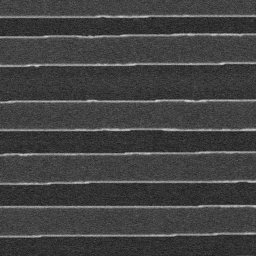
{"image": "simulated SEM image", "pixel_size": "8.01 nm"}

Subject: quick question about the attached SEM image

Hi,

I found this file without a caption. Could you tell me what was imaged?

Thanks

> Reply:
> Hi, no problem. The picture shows lines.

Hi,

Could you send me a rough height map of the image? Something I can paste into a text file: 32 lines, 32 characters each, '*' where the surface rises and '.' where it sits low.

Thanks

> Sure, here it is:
********************************
********************************
................................
................................
...............*****************
********************************
********************************
********************************
................................
................................
................................
................................
................................
********************************
********************************
********************************
................................
................................
................................
********************************
********************************
********************************
********************************
................................
................................
................................
********************************
********************************
********************************
*****...........................
................................
................................